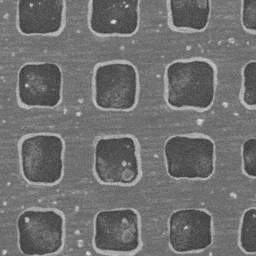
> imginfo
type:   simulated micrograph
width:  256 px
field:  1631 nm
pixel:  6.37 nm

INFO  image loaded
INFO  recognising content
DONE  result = a regular array of holes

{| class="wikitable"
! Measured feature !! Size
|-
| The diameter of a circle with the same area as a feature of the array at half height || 0.312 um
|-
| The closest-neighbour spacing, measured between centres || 463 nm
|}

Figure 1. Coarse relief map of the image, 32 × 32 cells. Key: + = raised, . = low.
++......+++......++++.....++++..
++......+++......++++.....++++..
++......+++......++++.....++++..
++......+++......+++++...++++++.
++++++++++++++++++++++++++++++++
++++++++++++++++++++++++++++++++
++++++++++++++++++++++++++++++++
++++++++++++++++++++++++.+++++++
+++....+++++.....++++......++++.
++......++++.....++++......++++.
++......++++.....++++......+++..
++......++++.....++++......+++..
++......++++.....++++......+++..
+++++++++++++...++++++++..++++++
++++++++++++++++++++++++++++++++
++++++++++++++++++++++++++++++++
++++++++++++++++++++++++++++++++
+++.....+++++....++++.....+++++.
++......++++.....++++......+++..
+++.....++++.....++++......+++..
+++.....++++.....++++......+++..
+++.....++++......+++......++++.
++++...+++++.....+++++++++++++++
++++++++++++++++++++++++++++++++
++++++++++++++++++++++++++++++++
++++++++++++++++++++++++++++++++
+++....++++++....+++++....+++++.
++......++++.....++++.....++++..
++......++++.....++++.....++++..
++......++++.....++++.....++++..
++......++++.....++++.....++++..
+++....++++++....+++++..+++++++.